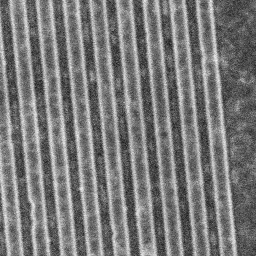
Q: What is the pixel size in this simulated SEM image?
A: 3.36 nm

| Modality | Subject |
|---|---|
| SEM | parallel lines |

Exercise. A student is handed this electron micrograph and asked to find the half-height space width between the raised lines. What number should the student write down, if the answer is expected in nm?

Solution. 41.3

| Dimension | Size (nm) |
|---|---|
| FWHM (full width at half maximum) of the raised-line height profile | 48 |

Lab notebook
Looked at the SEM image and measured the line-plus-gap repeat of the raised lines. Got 26.5 px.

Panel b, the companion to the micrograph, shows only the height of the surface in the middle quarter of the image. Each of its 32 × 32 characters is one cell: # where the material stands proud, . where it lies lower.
..###...####...###...####...####
..###...####...###....###...####
..###...####...###....###...####
..###....###...###....###...####
..###....###...####...###....###
..####...###...####...###....###
..####...###...####...###....###
..####...###...####...####...###
..####...###....###...####...###
..####...####...###...####...###
...###...####...###...####...###
...###...####...###....###...###
...###...####...###....###...###
...###....###...###....###...###
...###....###...####...###...###
...###....###...####...###....##
...####...###...####...###....##
...####...###...####...####...##
...####...###....###...####...##
...####...####...###...####...##
....###...####...###...####...##
....###...####...###...####...##
....###...####...####...###...##
#...###....###...###....###...##
#...###....###...####...###...##
#...###....###...####...###....#
#...####...###...####...###....#
#...####...###...####...###....#
#...####...###...####...####...#
#...####...###....###...####...#
#...####...####...###...####...#
#...####...####...###...####...#